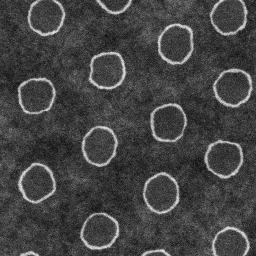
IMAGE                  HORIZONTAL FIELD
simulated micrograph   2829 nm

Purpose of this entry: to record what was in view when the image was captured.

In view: a regular array of raised bodies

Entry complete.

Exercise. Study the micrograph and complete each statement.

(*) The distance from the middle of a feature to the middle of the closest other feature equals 797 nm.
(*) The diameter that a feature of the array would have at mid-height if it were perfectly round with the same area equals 0.397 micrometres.